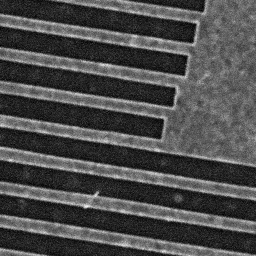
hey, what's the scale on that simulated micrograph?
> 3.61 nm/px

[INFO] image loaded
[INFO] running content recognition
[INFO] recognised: parallel lines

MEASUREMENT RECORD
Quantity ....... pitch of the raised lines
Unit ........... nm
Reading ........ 119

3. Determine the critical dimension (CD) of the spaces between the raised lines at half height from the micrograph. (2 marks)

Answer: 79.8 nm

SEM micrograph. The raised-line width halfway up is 38.4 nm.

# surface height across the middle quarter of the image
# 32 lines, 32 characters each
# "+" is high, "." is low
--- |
+++++++++++++..................+
...++++++++++++++++............+
........++++++++++++++++++.....+
..............++++++++++++++++++
.....................+++++++++++
...........................+++++
............................++++
++++........................++++
++++++++++..................++++
++++++++++++++++++..........++++
.......+++++++++++++++++....++++
.............+++++++++++++++++++
...................+++++++++++++
.........................+++++++
.........................+++++++
+........................+++++++
+++++++..................+++++++
++++++++++++++...........+++++++
...++++++++++++++++......+++++++
..........++++++++++++++++++++++
................++++++++++++++++
......................++++++++++
.............................+++
................................
+++++...........................
++++++++++++....................
++++++++++++++++++..............
........++++++++++++++++........
..............+++++++++++++++++.
.....................+++++++++++
...........................+++++
................................